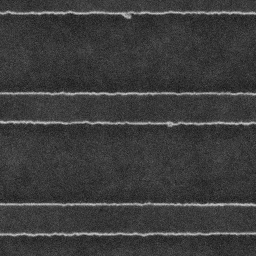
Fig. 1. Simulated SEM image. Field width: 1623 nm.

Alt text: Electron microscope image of lines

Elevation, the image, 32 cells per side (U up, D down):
UUUUUUUUUUUUUUUUUUUUUUUUUUUUUUUU
UUUUUUUUUUUUUUUUUUUUUUUUUUUUUUUU
DDDDDDDDDDDDDDDDDDDDDDDDDDDDDDDD
DDDDDDDDDDDDDDDDDDDDDDDDDDDDDDDD
DDDDDDDDDDDDDDDDDDDDDDDDDDDDDDDD
DDDDDDDDDDDDDDDDDDDDDDDDDDDDDDDD
DDDDDDDDDDDDDDDDDDDDDDDDDDDDDDDD
DDDDDDDDDDDDDDDDDDDDDDDDDDDDDDDD
DDDDDDDDDDDDDDDDDDDDDDDDDDDDDDDD
DDDDDDDDDDDDDDDDDDDDDDDDDDDDDDDD
DDDDDDDDDDDDDDDDDDDDDDDDDDDDDDDD
DDDDDDDDDDDDDDDDDDDDDDDDDDDDDDDD
UUUUUUUUUUUUUUUUUUUUUUUUUUUUUUUU
UUUUUUUUUUUUUUUUUUUUUUUUUUUUUUUU
UUUUUUUUUUUUUUUUUUUUUUUUUUUUUUUU
DDDDDDDDDDDDDDDDDDDDDDDDDDDDDDDD
DDDDDDDDDDDDDDDDDDDDDDDDDDDDDDDD
DDDDDDDDDDDDDDDDDDDDDDDDDDDDDDDD
DDDDDDDDDDDDDDDDDDDDDDDDDDDDDDDD
DDDDDDDDDDDDDDDDDDDDDDDDDDDDDDDD
DDDDDDDDDDDDDDDDDDDDDDDDDDDDDDDD
DDDDDDDDDDDDDDDDDDDDDDDDDDDDDDDD
DDDDDDDDDDDDDDDDDDDDDDDDDDDDDDDD
DDDDDDDDDDDDDDDDDDDDDDDDDDDDDDDD
DDDDDDDDDDDDDDDDDDDDDDDDDDDDDDDD
DDDDDDDDDDDDDDDDDDDDDDDDDDDDDDDD
UUUUUUUUUUUUUUUUUUUUUUUUUUUUUUUU
UUUUUUUUUUUUUUUUUUUUUUUUUUUUUUUU
UUUUUUUUUUUUUUUUUUUUUUUUUUUUUUUU
DDDDDDDDDDDDDDDDDDDDDDDDDDDDDDDD
DDDDDDDDDDDDDDDDDDDDDDDDDDDDDDDD
DDDDDDDDDDDDDDDDDDDDDDDDDDDDDDDD